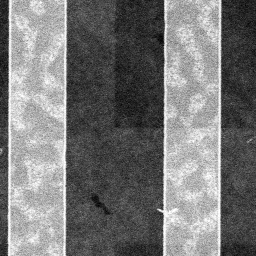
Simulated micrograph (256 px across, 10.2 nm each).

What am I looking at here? one or a few lines or trenches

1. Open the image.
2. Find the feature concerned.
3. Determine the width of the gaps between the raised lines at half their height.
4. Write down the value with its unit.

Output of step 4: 1020 nanometers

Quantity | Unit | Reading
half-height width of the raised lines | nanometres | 570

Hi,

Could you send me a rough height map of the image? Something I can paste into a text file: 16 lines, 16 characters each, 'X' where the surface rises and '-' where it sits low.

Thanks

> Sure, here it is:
-XXX------XXXX--
-XXX------XXXX--
-XXX------XXXX--
-XXX------XXXX--
-XXX------XXXX--
-XXX------XXXX--
-XXX------XXXX--
-XXX------XXXX--
-XXX------XXXX--
-XXX------XXXX--
-XXX------XXXX--
-XXX------XXXX--
-XXX------XXXX--
-XXX------XXXX--
-XXX------XXXX--
-XXX------XXXX--